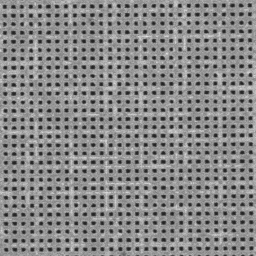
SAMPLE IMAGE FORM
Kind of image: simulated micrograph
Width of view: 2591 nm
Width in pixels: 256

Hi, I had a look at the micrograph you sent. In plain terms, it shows a regular array of holes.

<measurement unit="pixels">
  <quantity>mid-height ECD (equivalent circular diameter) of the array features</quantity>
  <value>4.52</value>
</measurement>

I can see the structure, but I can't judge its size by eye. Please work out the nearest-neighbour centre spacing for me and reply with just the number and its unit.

83.5 nm